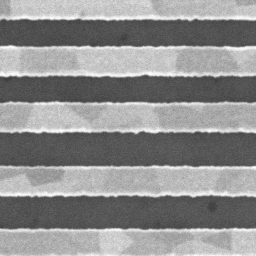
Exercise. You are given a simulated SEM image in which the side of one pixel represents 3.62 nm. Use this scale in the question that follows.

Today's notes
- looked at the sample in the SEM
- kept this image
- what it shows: lines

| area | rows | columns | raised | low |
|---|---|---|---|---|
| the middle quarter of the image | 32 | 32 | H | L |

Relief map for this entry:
HHHHHHHHHHHHHHHHHHHHHHHHHHHHHHHH
HHHHHHHHHHHHHHHHHHHHHHHHHHHHHHHH
HHHHHHHHHHHHHHHHHHHHLHHHHHHHHHHH
LLLLLLLLLLLLLLLLLLLLLLLLLLLLLLLL
LLLLLLLLLLLLLLLLLLLLLLLLLLLLLLLL
LLLLLLLLLLLLLLLLLLLLLLLLLLLLLLLL
LLLLLLLLLLLLLLLLLLLLLLLLLLLLLLLL
LLLLLLLLLLLLLLLLLLLLLLLLLLLLLLLL
LLLLLLLLLLLLLLLLLLLLLLLLLLLLLLLL
LLLLLLLLLLLLLLLLLLLLLLLLLLLLLLLL
HHHHHHHHHHHHHHHHHHHHHHHHHHHHHHHH
HHHHHHHHHHHHHHHHHHHHHHHHHHHHHHHH
HHHHHHHHHHHHHHHHHHHHHHHHHHHHHHHH
HHHHHHHHHHHHHHHHHHHHHHHHHHHHHHHH
HHHHHHHHHHHHHHHHHHHHHHHHHHHHHHHH
HHHHHHHHHHHHHHHHHHHHHHHHHHHHHHHH
HHHHHHHHHHHHHHHHHHHHHHHHHHHHHHHH
LLLLLLLLLLLLLLLLLLLLLLLLLLLLLLLL
LLLLLLLLLLLLLLLLLLLLLLLLLLLLLLLL
LLLLLLLLLLLLLLLLLLLLLLLLLLLLLLLL
LLLLLLLLLLLLLLLLLLLLLLLLLLLLLLLL
LLLLLLLLLLLLLLLLLLLLLLLLLLLLLLLL
LLLLLLLLLLLLLLLLLLLLLLLLLLLLLLLL
LLLLLLLLLLLLLLLLLLLLLLLLLLLLLLLL
LLLLLLLLLLLLLLLLLLLLLLLLLLLLLLLL
LLLLLLLLLLLLLLLLLLLLLLLLLLLLLLLL
HHHHHHHHHHHHHHHHHHHHHHHHHHHHHHHH
HHHHHHHHHHHHHHHHHHHHHHHHHHHHHHHH
HHHHHHHHHHHHHHHHHHHHHHHHHHHHHHHH
HHHHHHHHHHHHHHHHHHHHHHHHHHHHHHHH
HHHHHHHHHHHHHHHHHHHHHHHHHHHHHHHH
HHHHHHHHHHHHHHHHHHHHHHHHHHHHHHHH